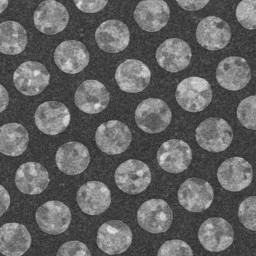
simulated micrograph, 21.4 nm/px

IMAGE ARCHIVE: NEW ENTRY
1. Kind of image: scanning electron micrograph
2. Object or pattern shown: a regular array of raised bodies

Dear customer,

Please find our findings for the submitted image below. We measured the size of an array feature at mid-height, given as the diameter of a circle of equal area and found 730 nanometres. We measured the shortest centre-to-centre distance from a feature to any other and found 955 nm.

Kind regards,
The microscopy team